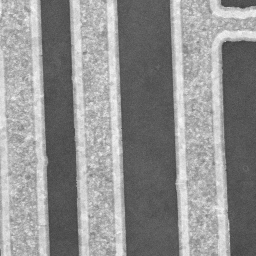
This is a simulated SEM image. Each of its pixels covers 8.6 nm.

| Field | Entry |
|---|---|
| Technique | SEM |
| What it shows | one or a few lines or trenches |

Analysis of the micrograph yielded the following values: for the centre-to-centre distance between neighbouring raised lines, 92.5 px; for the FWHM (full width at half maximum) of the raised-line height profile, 0.307 microns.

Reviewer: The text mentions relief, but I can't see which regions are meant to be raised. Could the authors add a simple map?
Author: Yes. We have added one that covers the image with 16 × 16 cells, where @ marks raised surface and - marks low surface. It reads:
@@---@@----@@@--
@@---@@----@@@@@
@@---@@----@@@--
@@---@@----@@---
@@---@@----@@---
@@---@@----@@---
@@---@@----@@@--
@@---@@----@@@--
@@---@@----@@@--
@@---@@----@@@--
@@@--@@----@@@--
@@@--@@----@@@--
@@@--@@----@@@--
@@@--@@-----@@--
@@@--@@-----@@--
@@@--@@-----@@--